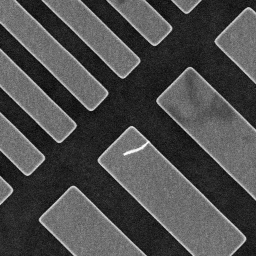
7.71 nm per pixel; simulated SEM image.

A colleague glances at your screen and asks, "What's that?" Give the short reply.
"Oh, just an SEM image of groups of lines, slits or small figures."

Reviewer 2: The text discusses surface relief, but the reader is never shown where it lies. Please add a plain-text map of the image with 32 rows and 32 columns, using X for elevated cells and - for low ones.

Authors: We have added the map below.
XX----XXXXX---XXXXX---XXX-------
XXX----XXXXX---XXXXX---X------XX
XXXX----XXXXX---XXXXX--------XXX
-XXXX----XXXXX---XXXX-------XXXX
--XXXX----XXXXX---XXX------XXXXX
---XXXX----XXXXX---X-------XXXXX
X---XXXXX---XXXXX-----------XXXX
X----XXXXX---XXXX------------XXX
XXX---XXXXX---XXX------X------XX
XXXX---XXXXX---X------XXX------X
XXXXX---XXXXX--------XXXXX------
-XXXXX---XXXX-------XXXXXXX-----
--XXXXX---XXX-------XXXXXXXX----
---XXXXX---X--------XXXXXXXXX---
----XXXX-------------XXXXXXXXX--
XX---XXXX-------------XXXXXXXXX-
XXX---XXX-------X------XXXXXXXXX
XXXX---X------XXXX------XXXXXXXX
XXXX----------XXXXX------XXXXXXX
-XXXXX-------XXXXXXXX-----XXXXXX
--XXX-------XXXXXXXXX------XXXXX
---X----------XXXXXXXXX-----XXXX
X-------------XXXXXXXXX------XXX
X--------X------XXXXXXXXX-----XX
X-------XXX-----XXXXXXXXXX-----X
-------XXXXX------XXXXXXXXX-----
------XXXXXXX------XXXXXXXXX----
-----XXXXXXXXX------XXXXXXXXX---
------XXXXXXXXX------XXXXXXXXX--
-------XXXXXXXXX------XXXXXXXXX-
--------XXXXXXXXX------XXXXXXX--
---------XXXXXXXXX------XXXXX---